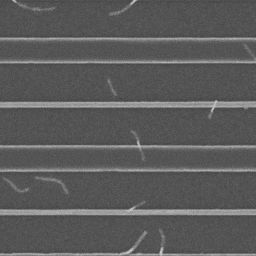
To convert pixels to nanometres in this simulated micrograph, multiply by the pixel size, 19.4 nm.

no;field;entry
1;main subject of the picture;lines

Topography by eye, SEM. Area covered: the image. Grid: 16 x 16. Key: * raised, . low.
................
................
****************
****************
................
................
................
................
................
****************
****************
................
................
................
................
................